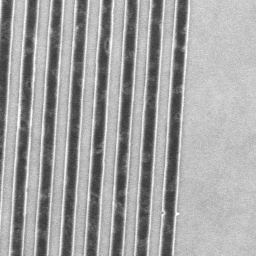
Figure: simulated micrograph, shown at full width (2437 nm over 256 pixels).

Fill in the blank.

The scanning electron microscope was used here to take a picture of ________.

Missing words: parallel lines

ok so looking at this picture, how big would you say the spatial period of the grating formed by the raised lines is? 0.238 micrometres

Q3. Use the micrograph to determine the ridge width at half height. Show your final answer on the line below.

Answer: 128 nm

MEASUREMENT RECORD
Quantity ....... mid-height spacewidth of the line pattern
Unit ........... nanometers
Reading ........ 104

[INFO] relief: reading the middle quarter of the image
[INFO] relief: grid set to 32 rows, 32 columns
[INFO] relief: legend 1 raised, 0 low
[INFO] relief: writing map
00111000111000011100011100011100
00111000111000111100011100011100
00111000111000111100011100011100
00111000111000111100111100011100
00111000111000111000111100011100
00111000111000111000111100011100
00111000111000111000111100011100
00111000111000111000111100111100
01111000111000111000111000111100
01111000111000111000100000111100
01110000111000111000111000111100
01110000111000111000111000111100
01110000111000111000111000111100
01110001111000111000111000111000
01110001111000111000111000111000
01110001111000111000111000111000
01110001111000111000111000111000
01110001110001111000111000111000
01110001110001111001111000111000
01110001110001110001111000111000
01110001110001110001111000111000
01110001110001110001111000111000
01110001110001110001111000111000
01110001110001110001111001111000
11110001110001110001110001111000
11110001110001110001110001111000
11100001110001110001110001111000
11100001110001110001110001111000
11100011110001110001110001110000
11100011110001110001110001110000
11100011110001110001110001110000
11100011100001110001110001110000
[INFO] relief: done